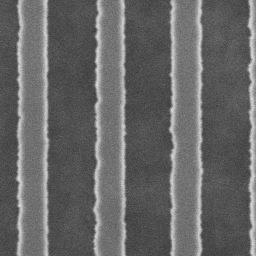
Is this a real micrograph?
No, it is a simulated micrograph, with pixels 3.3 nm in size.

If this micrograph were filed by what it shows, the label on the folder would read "lines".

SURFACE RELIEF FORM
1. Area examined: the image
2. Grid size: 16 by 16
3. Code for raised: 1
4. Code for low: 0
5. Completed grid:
0110001100011000
0110001100011000
0110001100011000
0110001100011000
0110001100011000
0110001100011000
0110001100011000
0110001100011000
0110001100011000
0110001100011000
0110001100011000
0110001100011000
0110001100011000
0110001100011000
0110001100011000
0110001100011000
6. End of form